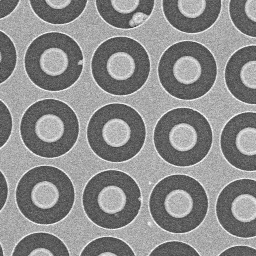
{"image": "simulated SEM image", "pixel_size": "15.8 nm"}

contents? an array of small figures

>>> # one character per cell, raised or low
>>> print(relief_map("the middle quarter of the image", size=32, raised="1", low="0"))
00000110000111111000001100001111
00000110000111111000011000001111
00001110000011111000011000001111
00001110000001000000011100001111
00011111000000000000011100000011
00111111100000000000111100000000
11111111110000000011111110000000
11111111111100000111111111100000
11111111111111111111111111110000
11111111111111111111111111111111
01111111110000001111111111111111
00111111000000000011111111100000
00011110000000000001111110000000
00011110000000000001111100000000
00001100000011000000111000000000
00001100001111110000111000001110
00001100001111110000111000011111
00001100001111110000110000011111
00011100001111110000110000011111
00011100000111100000111000011111
00111100000000000000111000001111
01111110000000000001111000000000
11111111000000000011111100000000
11111111100000000111111100000000
11111111111100111111111111000000
11111111111111111111111111110000
11111111111001111111111111111111
01111111000000001111111111111111
01111110000000000111111110000000
00111100000000000011111100000000
00111100000000000001111000000000
00011000001111000001110000000000